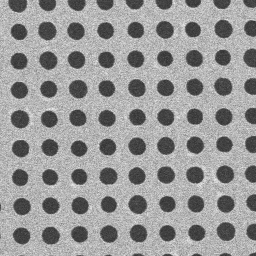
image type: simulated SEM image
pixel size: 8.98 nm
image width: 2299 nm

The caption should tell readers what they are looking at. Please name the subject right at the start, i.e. a regular array of holes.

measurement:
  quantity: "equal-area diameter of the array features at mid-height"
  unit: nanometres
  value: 155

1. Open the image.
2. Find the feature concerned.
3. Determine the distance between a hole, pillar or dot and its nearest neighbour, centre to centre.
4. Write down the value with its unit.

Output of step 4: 256 nm